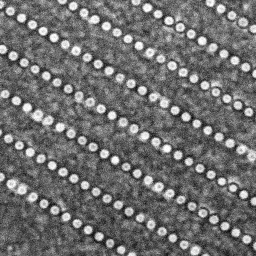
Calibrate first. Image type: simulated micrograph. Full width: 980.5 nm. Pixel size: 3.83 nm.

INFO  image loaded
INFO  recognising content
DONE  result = a regular array of raised bodies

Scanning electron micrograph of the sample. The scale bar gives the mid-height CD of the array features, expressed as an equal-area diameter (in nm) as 29.6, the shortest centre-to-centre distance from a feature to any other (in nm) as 48.8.